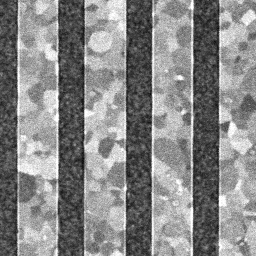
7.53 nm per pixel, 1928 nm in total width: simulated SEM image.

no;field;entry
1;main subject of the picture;one or a few lines or trenches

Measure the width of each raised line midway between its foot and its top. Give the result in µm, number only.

0.296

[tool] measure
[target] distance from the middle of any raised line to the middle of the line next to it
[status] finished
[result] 67.4 px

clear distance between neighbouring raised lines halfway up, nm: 204